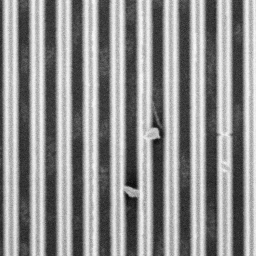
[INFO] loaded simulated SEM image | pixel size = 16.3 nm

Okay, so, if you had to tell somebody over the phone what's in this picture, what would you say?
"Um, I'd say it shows parallel lines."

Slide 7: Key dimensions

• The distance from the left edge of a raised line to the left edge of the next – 435 nm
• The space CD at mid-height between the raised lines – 248 nanometres